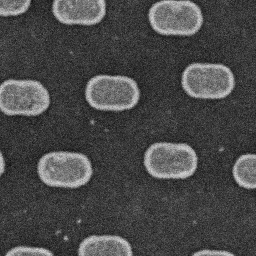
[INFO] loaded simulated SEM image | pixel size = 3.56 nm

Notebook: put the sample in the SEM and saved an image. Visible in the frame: raised bodies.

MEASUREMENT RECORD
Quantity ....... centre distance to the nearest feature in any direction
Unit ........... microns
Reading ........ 0.314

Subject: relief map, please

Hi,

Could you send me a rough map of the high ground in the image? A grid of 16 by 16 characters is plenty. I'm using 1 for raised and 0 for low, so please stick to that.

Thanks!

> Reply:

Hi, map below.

1001110000110000
0000000000110000
0000000000000000
0000000000000000
0000000000001100
1110001100001100
1110001100000000
0000000000000000
0000000000000000
0000000001110000
0001110001110001
0001100000000001
0000000000000000
0000000000000000
0000000000000000
0000011100000000